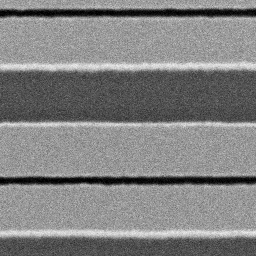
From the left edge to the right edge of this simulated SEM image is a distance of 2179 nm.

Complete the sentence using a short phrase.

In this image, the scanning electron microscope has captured lines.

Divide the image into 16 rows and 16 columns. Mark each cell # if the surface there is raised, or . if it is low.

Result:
################
################
################
################
................
................
................
................
################
################
################
################
################
################
#.#..###########
................